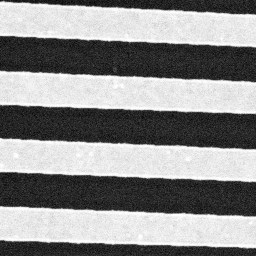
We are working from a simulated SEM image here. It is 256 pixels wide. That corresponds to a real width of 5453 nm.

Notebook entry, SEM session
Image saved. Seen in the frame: lines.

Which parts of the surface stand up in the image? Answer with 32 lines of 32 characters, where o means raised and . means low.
oooo............................
ooooooooooooooooooooooo.........
oooooooooooooooooooooooooooooooo
oooooooooooooooooooooooooooooooo
..oooooooooooooooooooooooooooooo
..........................oooooo
................................
................................
................................
oooooooooooo....................
oooooooooooooooooooooooooooooooo
oooooooooooooooooooooooooooooooo
oooooooooooooooooooooooooooooooo
............oooooooooooooooooooo
................................
................................
................................
oo..............................
ooooooooooooooooooooooooo.......
oooooooooooooooooooooooooooooooo
oooooooooooooooooooooooooooooooo
...ooooooooooooooooooooooooooooo
..............................oo
................................
................................
................................
ooooooooooooooo.................
oooooooooooooooooooooooooooooooo
oooooooooooooooooooooooooooooooo
oooooooooooooooooooooooooooooooo
.................ooooooooooooooo
................................